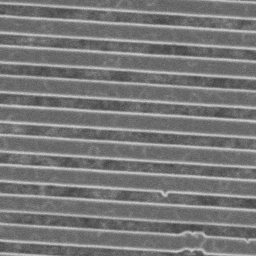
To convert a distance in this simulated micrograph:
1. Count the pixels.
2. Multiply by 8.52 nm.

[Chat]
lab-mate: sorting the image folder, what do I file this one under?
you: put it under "parallel lines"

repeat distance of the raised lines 252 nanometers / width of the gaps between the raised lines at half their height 0.102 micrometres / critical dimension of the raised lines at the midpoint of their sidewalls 148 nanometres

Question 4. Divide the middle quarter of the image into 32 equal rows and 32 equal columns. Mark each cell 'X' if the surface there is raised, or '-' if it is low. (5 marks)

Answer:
XXXXXXXXXXXXXXXXXXXXXXXXXXXXXXXX
--------------XX-XXXXXXXXXXXXXXX
-----------------------------XXX
--------------------------------
XXXXXXXXXXX---------------------
XXXXXXXXXXXXXXXXXXXXXXXXXX------
XXXXXXXXXXXXXXXXXXXXXXXXXXXXXXXX
XXXXXXXXXXXXXXXXXXXXXXXXXXXXXXXX
--------XXXXXXXXXXXXXXXXXXXXXXXX
------------------------XXXXXXXX
--------------------------------
XX------------------------------
XXXXXXXXXXXXXXXXXX--------------
XXXXXXXXXXXXXXXXXXXXXXXXXXXXXXXX
XXXXXXXXXXXXXXXXXXXXXXXXXXXXXXXX
XXXXXXXXXXXXXXXXXXXXXXXXXXXXXXXX
---------------XXXXXXXXXXXXXXXXX
-------------------------------X
--------------------------------
XXXXXXXXXXXX--------------------
XXXXXXXXXXXXXXXXXXXXXXXXXXXX----
XXXXXXXXXXXXXXXXXXXXXXXXXXXXXXXX
XXXXXXXXXXXXXXXXXXXXXXXXXXXXXXXX
----------XXXXXXXXXXXXXXXXXXXXXX
--------------------------XXXXXX
--------------------------------
XXXXXX--------------------------
XXXXXXXXXXXXXXXXXXX-------------
XXXXXXXXXXXXXXXXXXXXXXXXXXXXXXXX
XXXXXXXXXXXXXXXXXXXXXXXXXXXXXXXX
-----XXXXXXXXXXXXXXXXXXXXXXXXXXX
---------------------XXXXXXXXXXX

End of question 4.